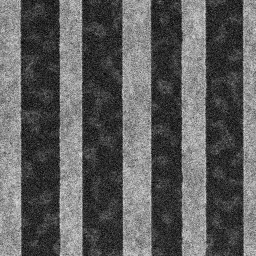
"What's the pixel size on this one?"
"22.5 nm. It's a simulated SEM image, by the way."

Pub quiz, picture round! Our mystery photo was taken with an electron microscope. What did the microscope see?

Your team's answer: one or a few lines or trenches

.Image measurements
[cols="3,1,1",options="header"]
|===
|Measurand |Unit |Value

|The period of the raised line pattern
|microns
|1.36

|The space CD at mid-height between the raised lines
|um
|0.874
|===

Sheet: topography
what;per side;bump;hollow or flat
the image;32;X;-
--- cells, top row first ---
XX------XX-----XXXX----XXX-----X
XX------XX-----XXXX----XXX-----X
XX------XX-----XXXX----XXX----XX
XX------XX-----XXXX----XXX-----X
XX------XX-----XXXX----XXX-----X
XX------XX-----XXXX----XXX-----X
XX------XX-----XXXX----XXX-----X
XX------XX-----XXXX----XXX-----X
XX------XX-----XXXX----XXX-----X
XX------XX-----XXXX----XXX-----X
XX------XX-----XXXX----XXX-----X
XX------XX-----XXXX----XXX-----X
XX------XX-----XXXX----XXX-----X
XX------XX-----XXXX----XXX-----X
XX------XX-----XXXX----XXX-----X
XX------XX-----XXXX----XXX-----X
XX------XX-----XXXX----XXX-----X
XX------XX-----XXXX----XXX-----X
XX------XX-----XXXX----XXX-----X
XX------XX-----XXXX----XXX-----X
XX------XX-----XXXX----XXX-----X
XX------XX-----XXXX----XXX-----X
XXX-----XX------XXX----XXX-----X
XXX-----XX------XXX----XXX-----X
XXX-----XX------XXX----XXX-----X
XXX-----XX------XXX----XXX-----X
XXX-----XX------XXX----XXX-----X
XXX-----XX------XXX----XXX-----X
XXX-----XX------XXX----XXX-----X
XXX-----XX------XXX----XXX-----X
XXX-----XX------XXX----XXX-----X
XXX-----XX------XXX----XXX-----X